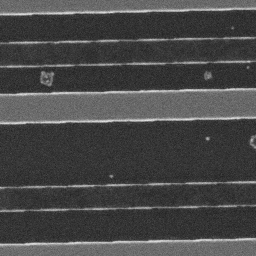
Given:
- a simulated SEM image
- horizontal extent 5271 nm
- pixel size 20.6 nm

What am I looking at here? lines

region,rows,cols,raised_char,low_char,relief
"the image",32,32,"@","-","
@@@@@@@@@@@@@@@@@@@@@@@@@@@@@@@@
@@@@@@@@@@@@@-------------------
--------------------------------
--------------------------------
--------------------------------
@@@@@@@@@@@@@@@@@@@@@@@@@@@@@@@@
@@@@@@@@@@@@@@@@@@@@@@@@@@@@@@@@
@@@@@@@@@@@@@@@@@@@@@@@@@@@@@@@@
--------------------------------
--------------------------------
--------------------------------
-------------@@@@@@@@@@@@@@@@@@@
@@@@@@@@@@@@@@@@@@@@@@@@@@@@@@@@
@@@@@@@@@@@@@@@@@@@@@@@@@@@@@@@@
@@@@@@@@@@@@@@@@@@@@@@@@@@@@@@@@
--------------------------------
--------------------------------
--------------------------------
--------------------------------
--------------------------------
--------------------------------
--------------------------------
--------------------------------
@@@@@@@@@@@@@@@@@@@@@@@@@@@@@@@@
@@@@@@@@@@@@@@@@@@@@@@@@@@@@@@@@
@@@@@@@@@@@@@@@@@@@@@@@@@@@@@@@@
--------------------------------
--------------------------------
--------------------------------
--------------------------------
----@@@@@@@@@@@@@@@@@@@@@@@@@@@@
@@@@@@@@@@@@@@@@@@@@@@@@@@@@@@@@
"